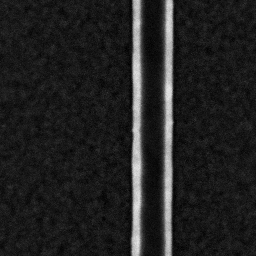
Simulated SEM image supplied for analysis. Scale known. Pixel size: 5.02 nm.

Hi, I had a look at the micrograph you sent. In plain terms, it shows one or a few lines or trenches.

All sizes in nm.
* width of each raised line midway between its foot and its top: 171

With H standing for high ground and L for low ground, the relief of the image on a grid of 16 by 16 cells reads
LLLLLLLLLHHLLLLL
LLLLLLLLLHHLLLLL
LLLLLLLLHHHLLLLL
LLLLLLLLHHHLLLLL
LLLLLLLLHHHLLLLL
LLLLLLLLHHHLLLLL
LLLLLLLLLHHLLLLL
LLLLLLLLLHHLLLLL
LLLLLLLLHHHLLLLL
LLLLLLLLLHHLLLLL
LLLLLLLLLHHLLLLL
LLLLLLLLLHHLLLLL
LLLLLLLLLHHLLLLL
LLLLLLLLLHHLLLLL
LLLLLLLLLHHLLLLL
LLLLLLLLHHHLLLLL